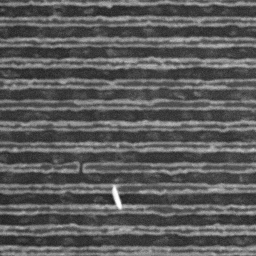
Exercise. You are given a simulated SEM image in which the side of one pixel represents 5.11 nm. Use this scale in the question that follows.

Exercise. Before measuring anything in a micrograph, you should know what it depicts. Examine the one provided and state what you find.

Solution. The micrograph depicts parallel lines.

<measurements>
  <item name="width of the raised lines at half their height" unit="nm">42.2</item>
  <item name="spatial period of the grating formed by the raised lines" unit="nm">107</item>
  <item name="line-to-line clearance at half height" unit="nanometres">65.1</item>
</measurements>